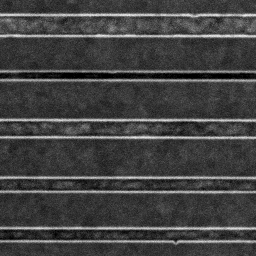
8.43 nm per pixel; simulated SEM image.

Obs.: parallel lines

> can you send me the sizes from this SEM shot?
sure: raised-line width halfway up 323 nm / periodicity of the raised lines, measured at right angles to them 440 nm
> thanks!